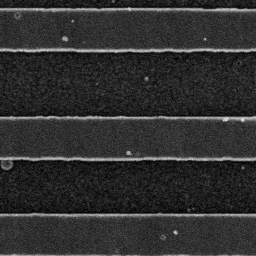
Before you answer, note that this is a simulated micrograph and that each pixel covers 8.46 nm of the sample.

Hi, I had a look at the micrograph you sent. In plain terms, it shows lines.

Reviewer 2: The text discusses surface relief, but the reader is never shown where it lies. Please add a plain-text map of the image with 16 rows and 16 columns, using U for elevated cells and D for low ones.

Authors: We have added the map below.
DDDDDDDDUDDDDDDD
UUUUUUUUUUUUUUUU
UUUUUUUUUUUUUUUU
DDDDDDDDDDDDDDDD
DDDDDDDDDDDDDDDD
DDDDDDDDDDDDDDDD
DDDDDDDDDDDDDDDD
UUUUUUUUUUUUUUUU
UUUUUUUUUUUUUUUU
UUUUUUUUUUUUUUUU
DDDDDDDDDDDDDDDD
DDDDDDDDDDDDDDDD
DDDDDDDDDDDDDDDD
UUUUUUUUUUUUUUUU
UUUUUUUUUUUUUUUU
UUUUUUUUUUUUUUUU